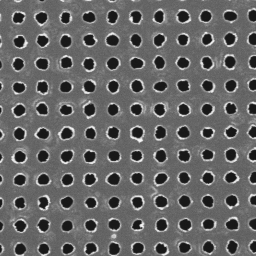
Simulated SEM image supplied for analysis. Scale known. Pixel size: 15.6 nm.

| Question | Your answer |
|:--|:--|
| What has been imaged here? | a regular array of holes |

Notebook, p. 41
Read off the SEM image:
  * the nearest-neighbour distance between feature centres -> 357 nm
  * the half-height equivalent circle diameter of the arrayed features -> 0.171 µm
